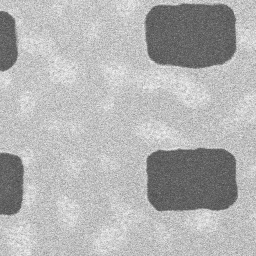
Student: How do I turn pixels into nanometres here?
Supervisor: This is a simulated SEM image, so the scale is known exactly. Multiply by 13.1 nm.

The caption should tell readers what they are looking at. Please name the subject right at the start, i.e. holes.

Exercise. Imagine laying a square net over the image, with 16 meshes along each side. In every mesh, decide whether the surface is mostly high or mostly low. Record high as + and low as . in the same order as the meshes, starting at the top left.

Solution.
++++++++++....++
.++++++++......+
.++++++++......+
.++++++++......+
++++++++++++++++
++++++++++++++++
++++++++++++++++
++++++++++++++++
++++++++++++++++
++++++++++....++
.++++++++......+
.++++++++......+
.++++++++......+
++++++++++++++++
++++++++++++++++
++++++++++++++++